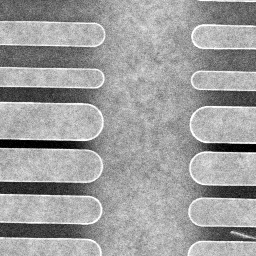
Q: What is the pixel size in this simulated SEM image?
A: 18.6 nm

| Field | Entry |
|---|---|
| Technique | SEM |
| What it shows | groups of lines, slits or small figures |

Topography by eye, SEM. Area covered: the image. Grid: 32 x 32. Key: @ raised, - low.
--------------------------------
--------------------------------
--------------------------------
@@@@@@@@@@@@@------------@@@@@@@
@@@@@@@@@@@@@-----------@@@@@@@@
@@@@@@@@@@@@------------@@@@@@@@
--------------------------------
--------------------------------
@@------------------------------
@@@@@@@@@@@@@-----------@@@@@@@@
@@@@@@@@@@@@@-----------@@@@@@@@
--------------------------------
--------------------------------
@@@@@@@@@@@@-------------@@@@@@@
@@@@@@@@@@@@@-----------@@@@@@@@
@@@@@@@@@@@@@-----------@@@@@@@@
@@@@@@@@@@@@@-----------@@@@@@@@
-------@@@@--------------@@@@@@@
--------------------------------
@@@@@@@@@@@@-------------@@@@@@@
@@@@@@@@@@@@@-----------@@@@@@@@
@@@@@@@@@@@@@-----------@@@@@@@@
@@@@@@@@@@@@------------@@@@@@@@
--------------------------------
@@@@@@@-------------------------
@@@@@@@@@@@@------------@@@@@@@@
@@@@@@@@@@@@@-----------@@@@@@@@
@@@@@@@@@@@@------------@@@@@@@@
--------------------------------
--------------------------------
@@@@@@@@@@@@------------@@@@@@@@
@@@@@@@@@@@@@-----------@@@@@@@@